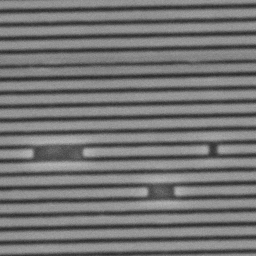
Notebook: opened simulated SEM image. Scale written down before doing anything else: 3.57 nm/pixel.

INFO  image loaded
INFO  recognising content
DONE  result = parallel lines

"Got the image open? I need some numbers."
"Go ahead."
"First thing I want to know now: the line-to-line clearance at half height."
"16.1 nanometres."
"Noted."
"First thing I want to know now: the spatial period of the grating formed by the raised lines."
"48.6 nanometres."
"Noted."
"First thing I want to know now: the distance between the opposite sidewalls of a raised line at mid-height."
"31.7 nanometres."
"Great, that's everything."